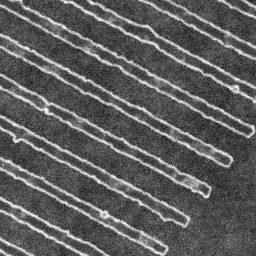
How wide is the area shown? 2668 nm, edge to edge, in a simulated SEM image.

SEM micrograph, parallel lines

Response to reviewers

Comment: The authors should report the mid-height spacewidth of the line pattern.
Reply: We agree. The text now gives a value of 252 nanometers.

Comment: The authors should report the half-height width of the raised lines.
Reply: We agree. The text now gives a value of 0.118 µm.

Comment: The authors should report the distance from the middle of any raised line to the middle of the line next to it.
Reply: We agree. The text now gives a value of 375 nanometers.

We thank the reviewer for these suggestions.